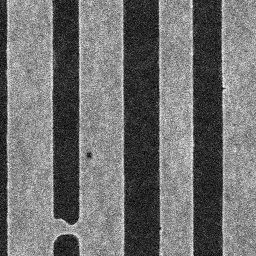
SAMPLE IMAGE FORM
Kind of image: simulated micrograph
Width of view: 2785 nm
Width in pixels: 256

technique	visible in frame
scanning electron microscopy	one or a few lines or trenches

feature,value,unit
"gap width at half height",322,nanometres